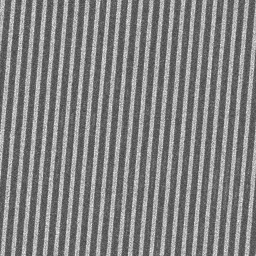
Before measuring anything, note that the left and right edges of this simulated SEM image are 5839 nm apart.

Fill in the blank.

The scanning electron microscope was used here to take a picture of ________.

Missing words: parallel lines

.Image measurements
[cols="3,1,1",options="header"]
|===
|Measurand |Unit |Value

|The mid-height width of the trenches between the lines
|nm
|156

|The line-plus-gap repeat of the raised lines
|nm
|241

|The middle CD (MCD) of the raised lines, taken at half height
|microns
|0.0767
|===